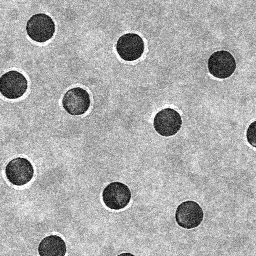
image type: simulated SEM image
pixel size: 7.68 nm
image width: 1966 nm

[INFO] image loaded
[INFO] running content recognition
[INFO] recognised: a regular array of holes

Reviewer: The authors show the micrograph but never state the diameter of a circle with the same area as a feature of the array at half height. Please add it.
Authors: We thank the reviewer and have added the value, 220 nm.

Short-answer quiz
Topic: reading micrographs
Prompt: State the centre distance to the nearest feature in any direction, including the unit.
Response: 0.6 µm